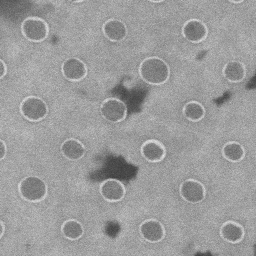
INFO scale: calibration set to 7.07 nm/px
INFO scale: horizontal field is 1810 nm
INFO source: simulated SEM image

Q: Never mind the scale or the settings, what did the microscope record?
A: a regular array of raised bodies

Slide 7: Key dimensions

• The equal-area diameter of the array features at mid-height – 172 nm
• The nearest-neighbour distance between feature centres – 0.399 um